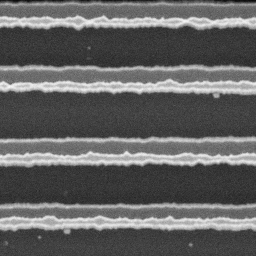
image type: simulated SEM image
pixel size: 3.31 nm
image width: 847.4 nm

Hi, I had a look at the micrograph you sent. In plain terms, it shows lines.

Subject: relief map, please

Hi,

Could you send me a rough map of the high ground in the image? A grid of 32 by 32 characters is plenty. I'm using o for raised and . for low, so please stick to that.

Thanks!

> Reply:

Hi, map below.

oooooooooooooooooooooooooooooo.o
oooooooooooooooooooooooooooooooo
oooooooooooooooooooooooooooooooo
................................
................................
................................
................................
................................
.........o.o...........oo.......
oooooooooooooooooooooooooooooooo
oooooooooooooooooooooooooooooooo
..............................o.
................................
................................
................................
................................
................................
.....o..oo...oo....o.o...oo.oooo
oooooooooooooooooooooooooooooooo
oooooooooooooooooooooooooooooooo
.......................o........
................................
................................
................................
................................
................................
oooooooooooooooooooooooooooooooo
oooooooooooooooooooooooooooooooo
................................
................................
................................
................................